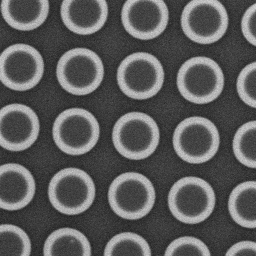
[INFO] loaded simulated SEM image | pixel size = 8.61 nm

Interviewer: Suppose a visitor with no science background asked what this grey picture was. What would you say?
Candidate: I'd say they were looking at an array of small figures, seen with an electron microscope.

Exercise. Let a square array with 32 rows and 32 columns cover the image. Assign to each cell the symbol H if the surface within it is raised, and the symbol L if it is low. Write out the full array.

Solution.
HHHHHHLLHHHHHLLLHHHHHLLLHHHHLLLL
HHHHHHLLHHHHHLLHHHHHHLLHHHHHLLLH
LHHHHHLLHHHHHLLHHHHHHLLHHHHHLLHH
LLHHLLLLLHHHHLLLHHHHHLLHHHHHLLHH
LLLLLLLLLLLLLLLLLHHHLLLHHHHHLLLH
LLLLLLLLLLLLLLLLLLLLLLLLLLLLLLLL
HHHHHLLLHHHHLLLLLLLLLLLLLLLLLLLL
HHHHHLLHHHHHHLLLHHHHLLLLHHLLLLLL
HHHHHLLHHHHHHLLHHHHHLLLHHHHLLLLH
HHHHHLLHHHHHHLLHHHHHLLHHHHHHLLHH
LHHHHLLLHHHHLLLHHHHHLLHHHHHHLLHH
LLLLLLLLLHHLLLLHHHHHLLLHHHHHLLHH
LLLLLLLLLLLLLLLLLLLLLLLHHHHLLLHH
HHHHLLLLLLLLLLLLLLLLLLLLLLLLLLLL
HHHHHLLHHHHHLLLHHHHLLLLLLLLLLLLL
HHHHHLLHHHHHLLHHHHHLLLHHHHHLLLLH
HHHHHLLHHHHHLLHHHHHHLLHHHHHLLLHH
HHHHLLLHHHHHLLHHHHHHLLHHHHHLLHHH
LHHLLLLHHHHLLLLHHHHLLLHHHHHLLHHH
LLLLLLLLLLLLLLLHHHLLLLHHHHHLLHHH
LHLLLLLLLLLLLLLLLLLLLLLLLLLLLLHH
HHHHLLLHHHHLLLLLLLLLLLLLLLLLLLLL
HHHHLLHHHHHLLLHHHHHLLLHHHLLLLLLL
HHHHLLHHHHHHLLHHHHHLLHHHHHLLLHHH
HHHHLLHHHHHHLLHHHHHLLHHHHHHLLHHH
HHHLLLLHHHHLLLHHHHHLLHHHHHHLLHHH
LLLLLLLLHHLLLLHHHHHLLHHHHHLLLHHH
LLLLLLLLLLLLLLLLLLLLLLHHHLLLLHHH
HHLLLLLLLLLLLLLLLLLLLLLLLLLLLLLL
HHHLLLHHHHHLLLHHHLLLLLLLLLLLLLLL
HHHHLLHHHHHLLHHHHHLLLHHHHLLLLHHH
HHHHLHHHHHHLLHHHHHHLLHHHHHLLHHHH